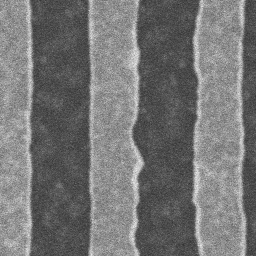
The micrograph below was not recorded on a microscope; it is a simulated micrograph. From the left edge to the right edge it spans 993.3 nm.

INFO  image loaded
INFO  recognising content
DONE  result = one or a few lines or trenches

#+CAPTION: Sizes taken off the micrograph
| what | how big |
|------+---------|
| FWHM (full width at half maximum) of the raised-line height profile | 170 nanometers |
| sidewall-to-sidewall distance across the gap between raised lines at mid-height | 241 nanometres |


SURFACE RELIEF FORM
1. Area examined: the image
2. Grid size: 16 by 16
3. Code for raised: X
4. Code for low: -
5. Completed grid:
XX----XXX----XX-
XX----XX----XXX-
XX----XX----XXX-
XX----XXX---XXX-
XX----XX----XXX-
XX----XXX---XXX-
XX----XXX---XXX-
XX----XX----XXX-
XX----XX----XXX-
XX----XXX---XXX-
XX----XXX---XXX-
XX----XX----XXX-
XX----XXX---XXX-
XX----XX----XXX-
XX----XX----XXX-
XX----XX-----XX-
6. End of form